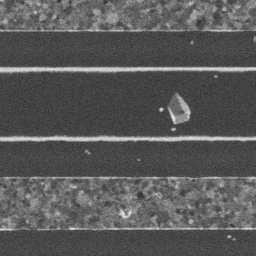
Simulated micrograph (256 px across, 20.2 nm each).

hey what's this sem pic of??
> lines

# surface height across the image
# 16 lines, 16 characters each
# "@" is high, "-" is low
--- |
@@@@@@@@@@@@@@@@
@@@@@@@@@@@@@@@@
----------------
----------------
@@@@@@@@@@@@@@@@
@@@@@@@@@@@@@@@@
@@@@@@@@@@@@@@@@
@@@@@@@@@@@@@@@@
@@@@@@@@@@@@@@@@
----------------
----------------
@@@@@@@@@@@@@@@@
@@@@@@@@@@@@@@@@
@@@@@@@@@@@@@@@@
----------------
----------------